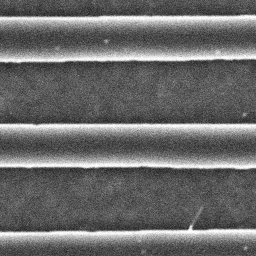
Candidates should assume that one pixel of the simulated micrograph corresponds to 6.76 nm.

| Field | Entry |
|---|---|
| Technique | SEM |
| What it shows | lines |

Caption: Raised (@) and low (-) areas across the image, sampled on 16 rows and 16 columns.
----------------
@@@@@@@@@@@@@@@@
@@@@@@@@@@@@@@@@
@@@@@@@@@@@@@@@@
----------------
----------------
----------------
----------------
@@@@@@@@@@@@@@@@
@@@@@@@@@@@@@@@@
---------------@
----------------
----------------
----------------
----@-@@@@@@@@@@
@@@@@@@@@@@@@@@@